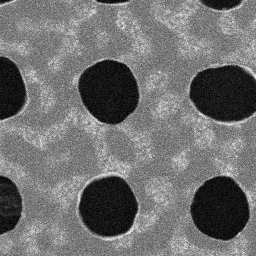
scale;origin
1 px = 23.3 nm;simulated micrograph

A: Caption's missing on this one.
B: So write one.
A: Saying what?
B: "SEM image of holes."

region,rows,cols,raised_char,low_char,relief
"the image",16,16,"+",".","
+++++++++++++..+
++++++++++++++++
++++++++++++++++
++++++++++++++++
.++++...+++++...
..+++....+++....
..+++....+++....
++++++..+++++..+
++++++++++++++++
++++++++++++++++
++++++++++++++++
.+++++..+++++..+
.++++....+++...+
.++++....+++....
++++++..+++++..+
++++++++++++++++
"